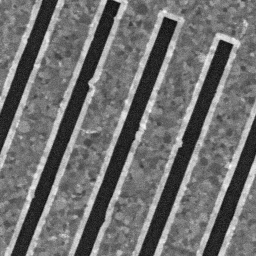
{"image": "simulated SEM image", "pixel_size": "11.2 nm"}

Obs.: parallel lines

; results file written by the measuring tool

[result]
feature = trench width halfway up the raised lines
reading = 216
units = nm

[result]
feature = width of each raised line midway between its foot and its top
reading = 454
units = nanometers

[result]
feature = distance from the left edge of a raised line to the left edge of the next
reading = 672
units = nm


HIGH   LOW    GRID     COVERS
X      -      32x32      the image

XXXXX--XXXXXX--XXXXXXXXXXXXXXXXX
XXXX---XXXXXX--XXXXXXXXXXXXXXXXX
XXXX---XXXXX---XXXXX--XXXXXXXXXX
XXXX--XXXXXX--XXXXXX--XXXXXXXXXX
XXX---XXXXX---XXXXX---XXXXXXXXXX
XXX---XXXXX---XXXXX--XXXXXX--XXX
XXX--XXXXXX--XXXXXX--XXXXXX--XXX
XX---XXXXX---XXXXX---XXXXX---XXX
XX--XXXXXX--XXXXXX--XXXXXX--XXXX
X---XXXXX---XXXXX---XXXXX---XXXX
X---XXXXX--XXXXXX---XXXXX---XXXX
X--XXXXXX--XXXXXX--XXXXXX--XXXXX
---XXXXX---XXXXX---XXXXX---XXXXX
---XXXXX--XXXXXX--XXXXXX---XXXXX
--XXXXXX--XXXXXX--XXXXXX--XXXXXX
--XXXXX---XXXXX---XXXXX---XXXXX-
-XXXXXX--XXXXXX--XXXXXX--XXXXXX-
-XXXXX---XXXXX---XXXXX---XXXXX--
-XXXXX---XXXXX---XXXXX---XXXXX--
XXXXXX--XXXXXX--XXXXXX--XXXXXX--
XXXXX---XXXXX---XXXXX---XXXXX---
XXXXX--XXXXXX--XXXXXX---XXXXX---
XXXXX--XXXXXX--XXXXXX--XXXXXX--X
XXXX---XXXXX---XXXXX---XXXXX---X
XXXX--XXXXXX--XXXXXX--XXXXXX--XX
XXXX--XXXXX---XXXXX---XXXXX---XX
XXX---XXXXX---XXXXX---XXXXX---XX
XXX--XXXXXX--XXXXXX--XXXXXX--XXX
XX---XXXXX---XXXXX---XXXXX---XXX
XX--XXXXXX--XXXXXX--XXXXXX---XXX
XX--XXXXX---XXXXXX--XXXXXX--XXXX
X---XXXXX---XXXXX---XXXXX---XXXX